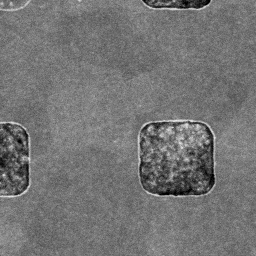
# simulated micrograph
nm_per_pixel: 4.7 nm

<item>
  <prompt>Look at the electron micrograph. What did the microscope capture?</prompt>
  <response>holes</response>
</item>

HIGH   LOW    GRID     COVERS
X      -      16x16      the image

-XXXXXXXXX--XXXX
XXXXXXXXXXXXXXXX
XXXXXXXXXXXXXXXX
XXXXXXXXXXXXXXXX
XXXXXXXXXXXXXXXX
XXXXXXXXXXXXXXXX
XXXXXXXXXXXXXXXX
XXXXXXXXXXXXXXXX
--XXXXXXX----XXX
--XXXXXXX----XXX
--XXXXXXX----XXX
--XXXXXXX----XXX
XXXXXXXXXXXXXXXX
XXXXXXXXXXXXXXXX
XXXXXXXXXXXXXXXX
XXXXXXXXXXXXXXXX